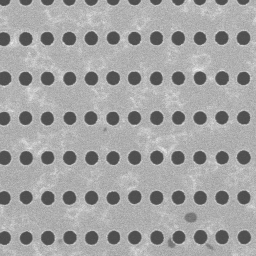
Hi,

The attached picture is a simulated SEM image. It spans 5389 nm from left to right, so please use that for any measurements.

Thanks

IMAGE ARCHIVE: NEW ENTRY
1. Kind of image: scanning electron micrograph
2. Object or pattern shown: a regular array of holes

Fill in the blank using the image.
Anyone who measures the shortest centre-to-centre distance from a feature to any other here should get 21.7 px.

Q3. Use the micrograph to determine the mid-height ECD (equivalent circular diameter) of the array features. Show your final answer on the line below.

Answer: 291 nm